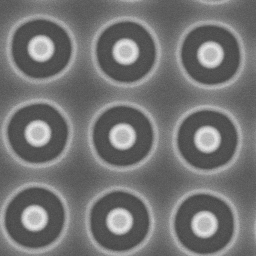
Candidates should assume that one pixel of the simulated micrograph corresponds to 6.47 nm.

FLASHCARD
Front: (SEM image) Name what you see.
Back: an array of small figures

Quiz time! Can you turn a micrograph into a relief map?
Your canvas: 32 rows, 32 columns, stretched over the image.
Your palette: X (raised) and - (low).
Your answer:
XXXXXXXXXXXXXXXXXXXXXXXXXXXXXXXX
XXXXXXXXXXXXXXXXXXXXXXXXXXXXXXXX
XXXX--XXXXXXXXX-XXXXXXXXXXXXXXXX
XX------XXXXX-----XXXXXX----XXXX
X--------XXX-------XXXX-------XX
X---XX---XXX---XX---XXX---X---XX
X---XX---XXX--XXX---XX---XXX--XX
X--------XXX---XX---XX---XX---XX
XX------XXXX-------XXXX-------XX
XXX----XXXXXX-----XXXXX-------XX
XXXXXXXXXXXXXXX--XXXXXXXX---XXXX
XXXXXXXXXXXXXXXXXXXXXXXXXXXXXXXX
XXXXXXXXXXXXXXXXXXXXXXXXXXXXXXXX
XX-----XXXXXX----XXXXXXXXXXXXXXX
X-------XXXX------XXXXX------XXX
X---X----XXX-------XXX-------XXX
X--XXX---XX---XXX--XXX---XX---XX
X---XX---XX---XXX--XXX---XX---XX
X-------XXXX-------XXX---XX---XX
XX------XXXX-------XXXX------XXX
XXXX--XXXXXXX----XXXXXX------XXX
XXXXXXXXXXXXXXXXXXXXXXXXXXXXXXXX
XXXXXXXXXXXXXXXXXXXXXXXXXXXXXXXX
XXX---XXXXXXXXXXXXXXXXXXXXXXXXXX
XX-----XXXXXX----XXXXXXX---XXXXX
X-------XXXX------XXXX-------XXX
---XX---XXX---XX---XXX-------XXX
---XXX--XXX---XX---XXX--XXX--XXX
----X---XXX---XX---XXX--XXX---XX
X-------XXX-------XXXX-------XXX
XX-----XXXXX------XXXX-------XXX
XXXXXXXXXXXXXX--XXXXXXXX----XXXX